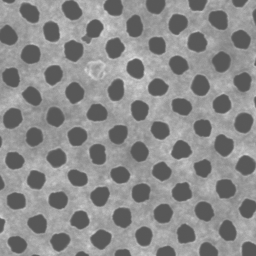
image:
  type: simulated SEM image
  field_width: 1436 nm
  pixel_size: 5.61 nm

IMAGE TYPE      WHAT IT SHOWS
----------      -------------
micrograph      a regular array of holes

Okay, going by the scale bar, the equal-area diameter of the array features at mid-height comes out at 107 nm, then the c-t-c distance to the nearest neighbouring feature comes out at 160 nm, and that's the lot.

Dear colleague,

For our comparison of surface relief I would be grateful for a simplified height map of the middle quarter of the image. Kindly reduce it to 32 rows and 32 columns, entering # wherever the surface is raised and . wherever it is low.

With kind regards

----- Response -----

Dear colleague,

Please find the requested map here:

################....######.....#
################....#######....#
################....########..##
##################.#############
############...#######...#######
#...#######....######.....######
.....######....######.....######
.....######....#######...#######
#....######...##################
#...#############...#######....#
#######...#######....######.....
######.....######....######.....
######.....######....########..#
######.....######...############
######################...#######
#############..#######....######
##...#######....######....######
#.....#####.....######....######
#.....#####....########..#######
#....#######...###.#########..##
###.###...#######...#######....#
######....#######....######.....
######....#######....######.....
.######...#######....######...##
#######...##############.#######
#######################...######
##.#########....######.....#####
#.....######.....#####.....#####
#.....######....#######...######
#.....#######...################
###..#############...#######...#
#######....######.....#####.....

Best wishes